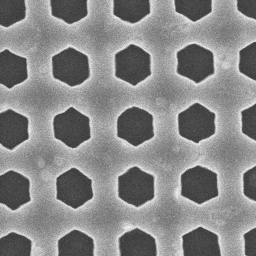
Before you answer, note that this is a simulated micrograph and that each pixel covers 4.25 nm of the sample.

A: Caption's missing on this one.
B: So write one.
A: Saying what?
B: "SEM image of a regular array of holes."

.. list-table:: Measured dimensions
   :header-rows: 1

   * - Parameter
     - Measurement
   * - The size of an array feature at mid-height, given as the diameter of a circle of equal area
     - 161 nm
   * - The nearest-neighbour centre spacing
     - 258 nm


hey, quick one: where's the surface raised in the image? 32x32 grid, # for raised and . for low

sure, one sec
...###.....###.....###....####..
...####....###.....###....####..
...#####..#####...######.#######
################################
################################
########################.######.
.#######..#####...####....####..
...####....###.....###.....###..
...###.....###.....###.....###..
...####....####....####...#####.
..######..######.###############
################################
################################
################.######...#####.
...####....####....###.....###..
....###....####....###.....###..
....###....####....###.....###..
...####....#####..######.#######
#.##############################
################################
################################
#.######..######..#####....####.
....###....####....####....###..
....###.....###....####....###..
....###.....###....####....####.
...#####..######..##############
################################
################################
################################
#..#####...####....####....####.
....###.....###.....###....####.
....###.....###.....###....####.